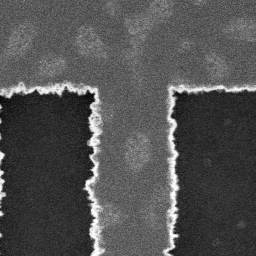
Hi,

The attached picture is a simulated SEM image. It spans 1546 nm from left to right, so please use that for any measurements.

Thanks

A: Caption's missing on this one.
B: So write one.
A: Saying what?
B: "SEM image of one or a few lines or trenches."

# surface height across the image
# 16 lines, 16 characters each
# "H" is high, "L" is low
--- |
HHHHHHHHHHHHHHHH
HHHHHHHHHHHHHHHH
HHHHHHHHHHHHHHHH
HHHHHHHHHHHHHHHH
HHHHHHHHHHHHHHHH
HHHHHHHHHHHHHHHH
LLLLLLHHHHHLLLLL
LLLLLLHHHHHLLLLL
LLLLLLHHHHHLLLLL
LLLLLLHHHHHLLLLL
LLLLLLHHHHHLLLLL
LLLLLLHHHHHLLLLL
LLLLLLHHHHHLLLLL
LLLLLLHHHHHLLLLL
LLLLLLHHHHHLLLLL
LLLLLLHHHHHLLLLL